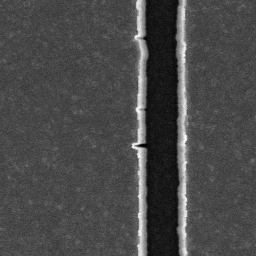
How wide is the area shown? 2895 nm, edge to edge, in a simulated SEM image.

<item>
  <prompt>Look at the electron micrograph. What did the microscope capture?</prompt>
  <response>one or a few lines or trenches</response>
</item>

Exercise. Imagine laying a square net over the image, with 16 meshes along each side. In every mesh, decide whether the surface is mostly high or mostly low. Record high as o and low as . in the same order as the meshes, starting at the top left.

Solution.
ooooooooo..ooooo
ooooooooo..ooooo
ooooooooo..ooooo
ooooooooo..ooooo
ooooooooo..ooooo
ooooooooo..ooooo
ooooooooo..ooooo
ooooooooo..ooooo
ooooooooo..ooooo
ooooooooo..ooooo
ooooooooo..ooooo
ooooooooo..ooooo
ooooooooo..ooooo
ooooooooo..ooooo
ooooooooo..ooooo
ooooooooo..ooooo